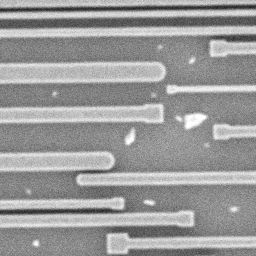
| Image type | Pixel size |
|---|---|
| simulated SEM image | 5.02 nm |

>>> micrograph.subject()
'groups of lines, slits or small figures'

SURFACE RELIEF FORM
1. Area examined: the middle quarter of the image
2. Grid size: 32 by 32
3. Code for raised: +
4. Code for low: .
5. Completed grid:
+++++++++++++++++++++++++.......
+++++++++++++++++++++++++.......
+++++++++++++++++++++++++.......
+++++++++++++++++++++++++.......
+...............................
................................
..........................++++++
................................
................................
................................
....................++++........
+++++++++++++++++++++++++.......
+++++++++++++++++++++++++.......
+++++++++++++++++++++++++......+
...............................+
................................
................................
................................
................................
................................
................................
................................
++++++++++++....................
++++++++++++....................
++++++++++++....................
++++++++++++....................
................................
..............................++
...+++++++++++++++++++++++++++++
...+++++++++++++++++++++++++++++
................................
................................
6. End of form